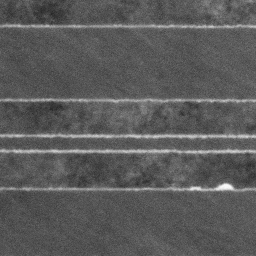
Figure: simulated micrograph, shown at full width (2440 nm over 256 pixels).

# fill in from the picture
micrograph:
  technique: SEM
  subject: lines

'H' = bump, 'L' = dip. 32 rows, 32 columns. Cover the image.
LLLLLLLLLLLLLLLLLLLLLLLLLLLLLLLL
LLLLLLLLLLLLLLLLLLLLLLLLLLLLLLLL
LLLLLLLLLLLLLLLLLLLLLLLLLLLLLLLL
HHHHHHHHHHHHHHHHHHHHHHHHHHHHHHHH
HHHHHHHHHHHHHHHHHHHHHHHHHHHHHHHH
HHHHHHHHHHHHHHHHHHHHHHHHHHHHHHHH
HHHHHHHHHHHHHHHHHHHHHHHHHHHHHHHH
HHHHHHHHHHHHHHHHHHHHHHHHHHHHHHHH
HHHHHHHHHHHHHHHHHHHHHHHHHHHHHHHH
HHHHHHHHHHHHHHHHHHHHHHHHHHHHHHHH
HHHHHHHHHHHHHHHHHHHHHHHHHHHHHHHH
HHHHHHHHHHHHHHHHHHHHHHHHHHHHHHHH
HHHHHHHHHHHHHHHHHHHHHHHHHHHHHHHH
LLLLLLLLLLLLLLLLLLLLLLLLLLLLLLLL
LLLLLLLLLLLLLLLLLLLLLLLLLLLLLLLL
LLLLLLLLLLLLLLLLLLLLLLLLLLLLLLLL
LLLLLLLLLLLLLLLLLLLLLLLLLLLLLLLL
HHHHHHHHHHHHHHHHHHHHHHHHHHHHHHHH
HHHHHHHHHHHHHHHHHHHHHHHHHHHHHHHH
LLLLLLLLLLLLLLLLLLLLLLLLLLLLLLLL
LLLLLLLLLLLLLLLLLLLLLLLLLLLLLLLL
LLLLLLLLLLLLLLLLLLLLLLLLLLLLLLLL
LLLLLLLLLLLLLLLLLLLLLLLLLLLLLLLL
LLLLLLLLLLLLLLLLLLLLLLLLLLLLLLLL
HHHHHHHHHHHHHHHHHHHHHHHHHHHHHHHH
HHHHHHHHHHHHHHHHHHHHHHHHHHHHHHHH
HHHHHHHHHHHHHHHHHHHHHHHHHHHHHHHH
HHHHHHHHHHHHHHHHHHHHHHHHHHHHHHHH
HHHHHHHHHHHHHHHHHHHHHHHHHHHHHHHH
HHHHHHHHHHHHHHHHHHHHHHHHHHHHHHHH
HHHHHHHHHHHHHHHHHHHHHHHHHHHHHHHH
HHHHHHHHHHHHHHHHHHHHHHHHHHHHHHHH